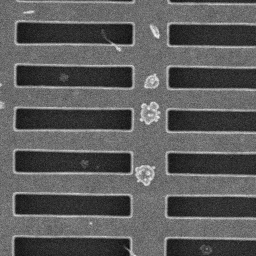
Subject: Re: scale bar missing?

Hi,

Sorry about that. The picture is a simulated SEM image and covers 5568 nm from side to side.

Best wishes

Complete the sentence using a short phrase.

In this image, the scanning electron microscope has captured groups of lines, slits or small figures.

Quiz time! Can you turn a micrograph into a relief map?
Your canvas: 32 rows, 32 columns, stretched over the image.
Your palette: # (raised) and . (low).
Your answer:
##############################..
################################
################################
##...............####...........
##...............####...........
###..........##.#####...........
################################
################################
##..............#####...........
##...............####...........
##...............####...........
################################
################################
###.############################
##...............####...........
##...............####...........
#########################.......
################################
################################
##..............#####...........
##..............#####...........
##..............#####...........
################################
################################
##..............#####...........
##..............#####...........
##..............#####...........
################################
################################
################################
##..............#####...........
##..............#####...........